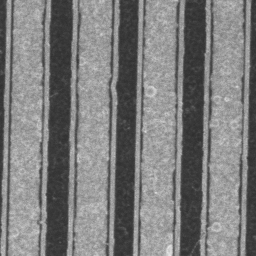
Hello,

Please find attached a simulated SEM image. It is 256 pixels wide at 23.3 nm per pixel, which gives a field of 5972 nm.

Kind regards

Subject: one or a few lines or trenches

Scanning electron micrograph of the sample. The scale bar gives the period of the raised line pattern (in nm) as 1560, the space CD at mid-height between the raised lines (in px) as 39.7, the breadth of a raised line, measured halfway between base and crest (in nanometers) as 624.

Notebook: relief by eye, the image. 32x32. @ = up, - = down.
@-----@@@------@@@-----@@@-----@
@-----@@@------@@@-----@@@-----@
@-----@@@------@@@-----@@@-----@
@-----@@@------@@@-----@@@-----@
@-----@@@------@@@-----@@@-----@
@-----@@@-----@@@@-----@@@-----@
@-----@@@-----@@@------@@@-----@
@-----@@@-----@@@------@@@-----@
@-----@@@-----@@@------@@@-----@
@-----@@@-----@@@-----@@@@-----@
@-----@@@-----@@@-----@@@@-----@
@-----@@@-----@@@-----@@@@-----@
@-----@@@-----@@@------@@@-----@
@-----@@@-----@@@-----@@@@-----@
@-----@@@-----@@@-----@@@@-----@
@-----@@@-----@@@-----@@@@-----@
@-----@@@-----@@@------@@@-----@
@-----@@@-----@@@-----@@@@-----@
@-----@@@-----@@@-----@@@@-----@
@-----@@@-----@@@-----@@@@-----@
@-----@@@-----@@@-----@@@@-----@
@-----@@@-----@@@-----@@@@-----@
@-----@@@-----@@@-----@@@@-----@
@----@@@@-----@@@-----@@@@-----@
@----@@@@-----@@@-----@@@@-----@
@-----@@@-----@@@-----@@@@----@@
@----@@@@-----@@@-----@@@@----@@
@----@@@@-----@@@-----@@@@----@@
-----@@@@-----@@@-----@@@-----@@
-----@@@@-----@@@-----@@@-----@@
-----@@@@-----@@@-----@@@-----@@
-----@@@@-----@@@-----@@@-----@@